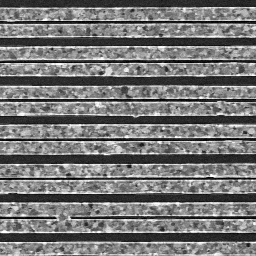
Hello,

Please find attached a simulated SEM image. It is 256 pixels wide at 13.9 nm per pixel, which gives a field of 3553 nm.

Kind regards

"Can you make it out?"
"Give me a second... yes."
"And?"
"parallel lines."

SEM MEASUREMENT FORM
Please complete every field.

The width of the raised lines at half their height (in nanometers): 175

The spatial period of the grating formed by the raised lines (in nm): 271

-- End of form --